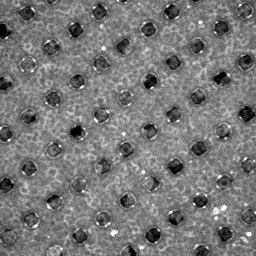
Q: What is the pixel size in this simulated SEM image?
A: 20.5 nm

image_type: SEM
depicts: a regular array of raised bodies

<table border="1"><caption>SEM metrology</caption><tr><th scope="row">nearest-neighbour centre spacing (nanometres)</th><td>602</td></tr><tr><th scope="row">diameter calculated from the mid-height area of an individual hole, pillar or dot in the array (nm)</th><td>313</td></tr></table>